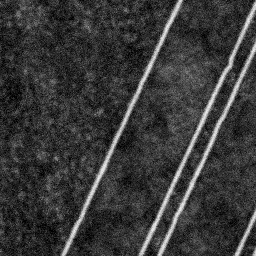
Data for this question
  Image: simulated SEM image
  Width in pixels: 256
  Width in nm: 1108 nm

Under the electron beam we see one or a few lines or trenches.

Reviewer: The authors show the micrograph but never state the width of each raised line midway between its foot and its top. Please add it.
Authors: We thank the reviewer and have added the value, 0.0772 µm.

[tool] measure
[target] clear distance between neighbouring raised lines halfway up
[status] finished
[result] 303 nm